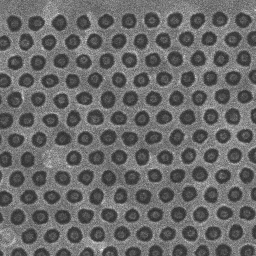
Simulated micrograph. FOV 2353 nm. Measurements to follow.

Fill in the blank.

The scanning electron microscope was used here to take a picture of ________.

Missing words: a regular array of ring-shaped grooves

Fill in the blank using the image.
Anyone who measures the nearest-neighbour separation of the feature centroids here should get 0.198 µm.